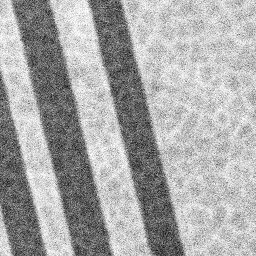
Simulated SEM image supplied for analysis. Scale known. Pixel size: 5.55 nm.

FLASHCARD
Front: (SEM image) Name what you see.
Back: one or a few lines or trenches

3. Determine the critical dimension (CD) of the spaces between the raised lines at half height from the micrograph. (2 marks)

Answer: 0.203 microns